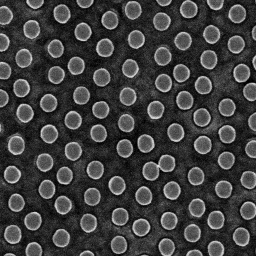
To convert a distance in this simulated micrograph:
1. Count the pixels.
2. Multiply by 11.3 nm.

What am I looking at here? a regular array of raised bodies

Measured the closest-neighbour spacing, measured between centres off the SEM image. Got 293 nanometers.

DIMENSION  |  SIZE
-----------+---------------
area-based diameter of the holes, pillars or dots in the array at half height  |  192 nm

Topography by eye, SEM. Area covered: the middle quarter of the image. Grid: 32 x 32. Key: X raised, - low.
-XXXX----------XXX----------XX--
-XXXX---XX-----XXX---------XXXX-
--XX----XXX----XXX---------XXXX-
-------XXXX------------XXX--XXX-
--------XXX------------XXXX-----
---------X-------------XXXX-----
---XXX---------XX-------XX------
--XXXX--------XXXX-----------XXX
--XXXX--------XXXX----------XXXX
---XXX---X----XXX-----XX----XXXX
-------XXXX----------XXXX----XXX
-------XXXX----------XXXX-------
-XXX---XXXX----------XXXX-------
XXXX-----X----XXX-----XX--------
XXXX----------XXX---------------
-XXX----XX----XXX----------XX---
-------XXX----XXX---------XXXX--
-------XXXX---------------XXXX--
-------XXX---------XXX-----XX---
--------------XX--XXXX----------
-XXX---------XXXX--XXX----------
XXXX---------XXXX--XXX----------
-XXX----------XXX---------------
-XXX--------------------XXX-----
-------XX---------------XXXX----
------XXXX----------XXXXXXXX----
XX----XXXX----------XXXX-XX-----
XX----XXXX----------XXXX-------X
XX-----XX---XX-------XX--------X
X----------XXXX------------X----
-----------XXXX----------XXXX---
------XX----XXX----XX----XXXX---